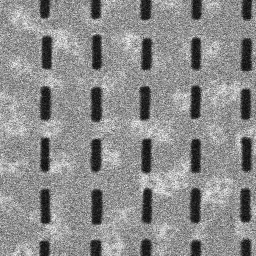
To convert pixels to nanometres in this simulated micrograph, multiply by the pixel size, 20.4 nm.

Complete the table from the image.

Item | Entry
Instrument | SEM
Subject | a regular array of holes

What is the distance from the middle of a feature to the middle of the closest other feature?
1020 nanometres